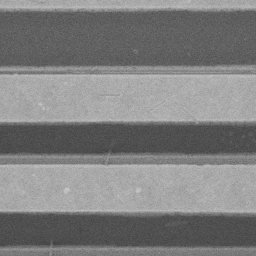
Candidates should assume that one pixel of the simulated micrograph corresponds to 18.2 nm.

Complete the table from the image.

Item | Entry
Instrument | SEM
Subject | lines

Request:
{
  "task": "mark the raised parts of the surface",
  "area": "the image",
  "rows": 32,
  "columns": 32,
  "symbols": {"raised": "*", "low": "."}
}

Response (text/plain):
********************************
................................
................................
................................
................................
................................
................................
................................
................................
********************************
********************************
********************************
********************************
********************************
********************************
................................
................................
................................
................................
.............******.............
********************************
********************************
********************************
********************************
********************************
********************************
********************************
................................
................................
................................
................................
********************************